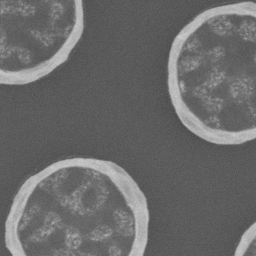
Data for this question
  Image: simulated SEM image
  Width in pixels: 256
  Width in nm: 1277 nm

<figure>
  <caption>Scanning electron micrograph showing raised bodies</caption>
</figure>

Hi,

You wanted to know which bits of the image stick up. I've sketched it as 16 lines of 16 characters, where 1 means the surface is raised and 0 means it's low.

1111100000000010
1111100000001111
1111000000011111
1111000000011111
1110000000011111
0000000000011111
0000000000011111
0000000000001111
0000000000000110
0000000000000000
0001111000000000
0011111100000000
0111111110000000
0111111110000000
0111111110000000
0111111110000001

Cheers